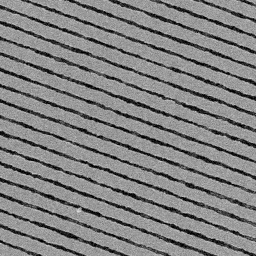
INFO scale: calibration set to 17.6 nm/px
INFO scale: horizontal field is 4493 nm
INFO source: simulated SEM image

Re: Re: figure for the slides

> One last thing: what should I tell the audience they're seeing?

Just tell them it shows parallel lines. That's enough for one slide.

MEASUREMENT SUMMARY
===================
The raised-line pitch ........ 258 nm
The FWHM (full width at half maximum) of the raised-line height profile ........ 192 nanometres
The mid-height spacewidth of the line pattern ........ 3.77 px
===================